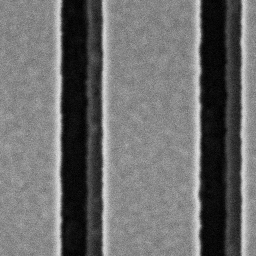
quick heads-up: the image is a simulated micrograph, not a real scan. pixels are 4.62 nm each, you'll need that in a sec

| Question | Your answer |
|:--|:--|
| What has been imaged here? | lines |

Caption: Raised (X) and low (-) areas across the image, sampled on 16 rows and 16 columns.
XXXX--XXXXXXX--X
XXXX--XXXXXXX--X
XXXX--XXXXXXX--X
XXXX--XXXXXX---X
XXXX--XXXXXXX--X
XXXX--XXXXXX---X
XXXX--XXXXXX---X
XXXX--XXXXXXX--X
XXXX--XXXXXXX--X
XXXX--XXXXXXX--X
XXXX--XXXXXX---X
XXXX--XXXXXX---X
XXXX--XXXXXX---X
XXXX--XXXXXX---X
XXXX--XXXXXX---X
XXXX--XXXXXX--XX